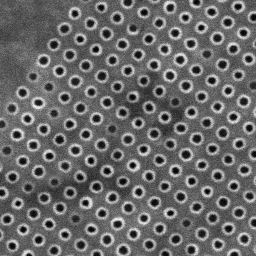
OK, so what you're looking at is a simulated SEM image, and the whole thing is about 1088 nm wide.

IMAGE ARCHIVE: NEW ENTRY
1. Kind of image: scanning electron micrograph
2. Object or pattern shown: a regular array of holes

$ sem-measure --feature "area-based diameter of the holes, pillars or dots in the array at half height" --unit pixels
7.65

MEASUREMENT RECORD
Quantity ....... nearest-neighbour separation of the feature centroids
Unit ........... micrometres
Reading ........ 0.0796